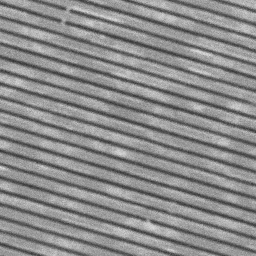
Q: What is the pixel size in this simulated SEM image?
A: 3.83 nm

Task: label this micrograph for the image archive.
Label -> parallel lines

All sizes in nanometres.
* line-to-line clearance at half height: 16.1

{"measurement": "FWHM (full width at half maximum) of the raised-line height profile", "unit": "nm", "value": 32.7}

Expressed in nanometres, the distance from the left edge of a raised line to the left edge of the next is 49.2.